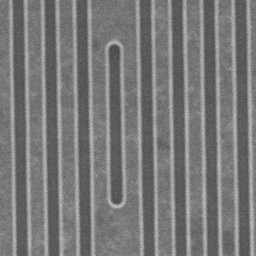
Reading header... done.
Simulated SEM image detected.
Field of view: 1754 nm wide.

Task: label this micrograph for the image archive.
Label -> groups of lines, slits or small figures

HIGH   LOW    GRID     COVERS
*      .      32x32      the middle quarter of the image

***....****....****....***....**
***....****....****....****....*
***....****....****....****....*
***....****....****....****....*
***....****....****....****....*
***....****....****....****....*
***....****....****....****....*
***....****....****....****....*
***....****....****....****....*
***....****....****....****....*
***....****....****....****....*
***....****....****....****....*
***....****....****....****....*
***....****....****....****....*
***....****....****....****....*
***....****....****....****....*
***....****....****....****....*
***....****....****....****....*
***....****....****....****....*
***....****....****....****....*
***....****....****....****....*
***....****....****....****....*
***....****....****....****....*
***....****....****....****....*
***....****....****....****....*
***....****....****....****....*
***....****....****....****....*
***....****....****....****....*
***....****....****....****....*
***....****....****....****....*
***....****....****....****....*
***....****....****....****....*